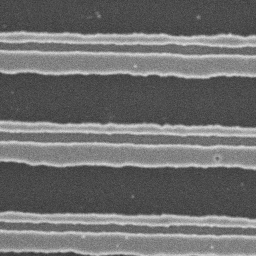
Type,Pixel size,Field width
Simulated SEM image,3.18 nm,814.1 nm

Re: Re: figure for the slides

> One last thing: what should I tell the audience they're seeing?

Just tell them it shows lines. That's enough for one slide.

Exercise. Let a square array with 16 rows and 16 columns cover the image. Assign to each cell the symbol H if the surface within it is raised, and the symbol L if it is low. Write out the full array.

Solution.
LLLLLLLLLLLLLLLL
LLLLLLLLLLLLLLLL
HHHHHHHHHHHHHHHH
HHHHHHHHHHHHHHHH
HHHHHHHHHHHHHHHH
LLLLLLLLLLLLLLLL
LLLLLLLLLLLLLLLL
LLLLLLLLLLLLLLLL
HHHHHHHHHHHHHHHH
HHHHHHHHHHHHHHHH
LLLLLLLLLLLLLLLH
LLLLLLLLLLLLLLLL
LLLLLLLLLLLLLLLL
HHHHHHHLLLHLLLLL
HHHHHHHHHHHHHHHH
HHHHHHHHHHHHHHHH